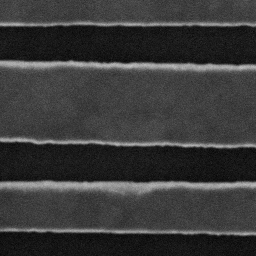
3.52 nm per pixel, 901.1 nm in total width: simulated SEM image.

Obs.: lines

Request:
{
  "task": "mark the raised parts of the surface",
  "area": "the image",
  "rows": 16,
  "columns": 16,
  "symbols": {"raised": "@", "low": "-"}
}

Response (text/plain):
@@@@@@@@@@@@@@@@
@@@@@@@@@@@@@@@@
----------------
----------------
@@@@@@@@@@@@@@@@
@@@@@@@@@@@@@@@@
@@@@@@@@@@@@@@@@
@@@@@@@@@@@@@@@@
@@@@@@@@@@@@@@@@
----------------
----------------
@@@@@@@--@@@@@@@
@@@@@@@@@@@@@@@@
@@@@@@@@@@@@@@@@
-------@@@@@@@@@
----------------